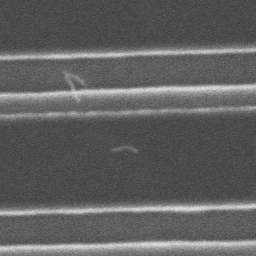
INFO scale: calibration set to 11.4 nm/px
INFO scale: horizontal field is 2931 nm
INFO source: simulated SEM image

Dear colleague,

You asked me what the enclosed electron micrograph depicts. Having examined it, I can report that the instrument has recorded lines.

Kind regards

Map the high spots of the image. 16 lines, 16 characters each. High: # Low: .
################
################
################
####............
................
..............##
################
################
################
################
################
################
################
................
................
################